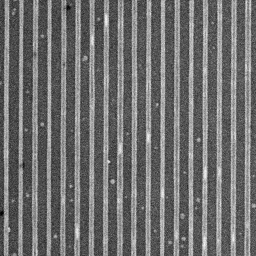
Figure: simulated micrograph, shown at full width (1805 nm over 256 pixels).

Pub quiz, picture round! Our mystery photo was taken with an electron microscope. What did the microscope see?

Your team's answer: parallel lines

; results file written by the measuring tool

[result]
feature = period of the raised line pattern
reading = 0.1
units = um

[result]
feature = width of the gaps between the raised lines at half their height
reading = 67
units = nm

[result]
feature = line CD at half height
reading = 32.6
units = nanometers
